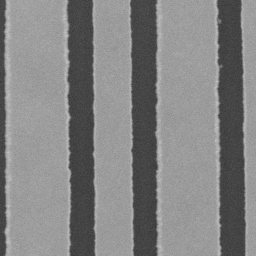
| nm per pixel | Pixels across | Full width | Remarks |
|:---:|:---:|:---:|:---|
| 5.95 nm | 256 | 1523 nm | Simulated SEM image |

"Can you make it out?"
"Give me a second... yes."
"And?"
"lines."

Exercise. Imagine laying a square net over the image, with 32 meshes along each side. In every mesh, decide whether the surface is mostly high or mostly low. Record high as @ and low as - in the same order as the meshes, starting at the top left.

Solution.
-@@@@@@@----@@@@----@@@@@@@---@@
-@@@@@@@----@@@@----@@@@@@@---@@
-@@@@@@@----@@@@----@@@@@@@---@@
-@@@@@@@@---@@@@----@@@@@@@---@@
-@@@@@@@----@@@@----@@@@@@@---@@
-@@@@@@@----@@@@----@@@@@@@---@@
-@@@@@@@@---@@@@----@@@@@@@---@@
-@@@@@@@@---@@@@----@@@@@@@---@@
-@@@@@@@@---@@@@----@@@@@@@---@@
-@@@@@@@----@@@@----@@@@@@@---@@
-@@@@@@@@---@@@@----@@@@@@@---@@
-@@@@@@@@---@@@@----@@@@@@@----@
-@@@@@@@----@@@@----@@@@@@@---@@
-@@@@@@@@---@@@@----@@@@@@@----@
-@@@@@@@@---@@@@----@@@@@@@----@
-@@@@@@@@---@@@@----@@@@@@@---@@
-@@@@@@@@---@@@@---@@@@@@@@---@@
-@@@@@@@@---@@@@@---@@@@@@@----@
-@@@@@@@@---@@@@----@@@@@@@----@
-@@@@@@@@---@@@@----@@@@@@@----@
-@@@@@@@@---@@@@----@@@@@@@----@
-@@@@@@@@---@@@@----@@@@@@@----@
-@@@@@@@@---@@@@----@@@@@@@----@
-@@@@@@@@---@@@@----@@@@@@@----@
-@@@@@@@@---@@@@@---@@@@@@@----@
-@@@@@@@@---@@@@@---@@@@@@@----@
-@@@@@@@@---@@@@@---@@@@@@@----@
-@@@@@@@@---@@@@@---@@@@@@@----@
-@@@@@@@@---@@@@@---@@@@@@@----@
-@@@@@@@@---@@@@@---@@@@@@@----@
-@@@@@@@@---@@@@@---@@@@@@@----@
-@@@@@@@@---@@@@@---@@@@@@@@---@